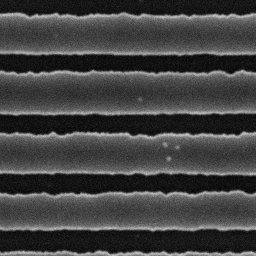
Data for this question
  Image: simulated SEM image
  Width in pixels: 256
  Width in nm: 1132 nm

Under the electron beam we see lines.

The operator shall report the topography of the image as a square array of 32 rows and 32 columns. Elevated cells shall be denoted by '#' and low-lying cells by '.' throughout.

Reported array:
................................
................................
################################
################################
################################
################################
################################
................................
................................
################################
################################
################################
################################
################################
................................
................................
................................
################################
################################
################################
################################
################################
................................
................................
################################
################################
################################
################################
################################
................................
................................
.####..##...#..........#........